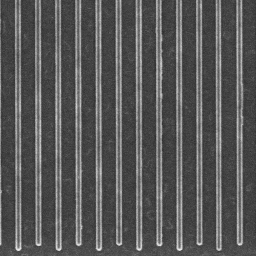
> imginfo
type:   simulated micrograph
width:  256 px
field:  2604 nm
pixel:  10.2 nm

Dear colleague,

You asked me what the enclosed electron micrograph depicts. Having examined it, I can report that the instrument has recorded parallel lines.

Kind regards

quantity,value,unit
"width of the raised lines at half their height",47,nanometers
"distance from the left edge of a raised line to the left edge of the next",205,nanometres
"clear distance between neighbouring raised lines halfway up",160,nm